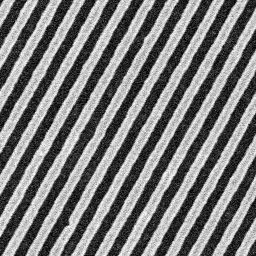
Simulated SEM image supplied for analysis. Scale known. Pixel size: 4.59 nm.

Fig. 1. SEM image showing parallel lines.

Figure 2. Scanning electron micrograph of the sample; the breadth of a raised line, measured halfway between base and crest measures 42.7 nanometres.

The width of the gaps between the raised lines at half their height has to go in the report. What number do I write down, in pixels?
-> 10.9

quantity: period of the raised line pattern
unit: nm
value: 93.4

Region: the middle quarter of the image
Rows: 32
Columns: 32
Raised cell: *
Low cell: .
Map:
**...***...**....**...***...***.
*....**...***...***...***...**..
*...***...**....***..***...***..
....**...***...***...***...**...
...***...**....**...***...***...
..***...***...***...**....**...*
..***...**...***...***...***...*
.***...***...***...**...***...**
.**....**...***...***...**....**
***...***...***..***...***...***
**...***...***...***...**...***.
**...**....**...***...***...***.
*...***...***...**....**...***..
....**....**...***...***...***..
...***...***...**....**...***...
...**...***...***...***...**....
..***...***...**...***...***...*
.***....**...***...**....**...**
.***...***...**...***...***...**
.**...***...***...**....**...***
**....**....**...***...***...**.
**...***...***...**....**...***.
*....**...***...***...***...**..
*...***...**....**...***...***..
....**...***...***...***...**...
...***...**....**...***...***...
..***...***...**....**....**...*
..**...***...***...***...***...*
.***...***...**....**...***...**
.**...***...***...***...***...**
***...***...**....**....**...***
**...***...***...***...**....**.